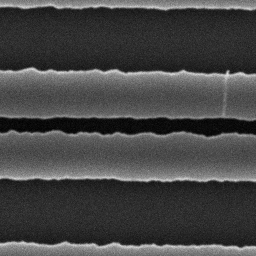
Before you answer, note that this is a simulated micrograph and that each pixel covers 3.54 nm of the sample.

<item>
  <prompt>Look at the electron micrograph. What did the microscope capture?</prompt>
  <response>lines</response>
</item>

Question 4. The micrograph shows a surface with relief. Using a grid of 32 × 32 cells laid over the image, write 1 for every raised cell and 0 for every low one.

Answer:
11111111111111111111111111111111
00000000000000000000000000000000
00000000000000000000000000000000
00000000000000000000000000000000
00000000000000000000000000000000
00000000000000000000000000000000
00000000000000000000000000000000
00000000000000000000000000000000
00000000000000000000000000000000
11111111111111111111111111111111
11111111111111111111111111111111
11111111111111111111111111111111
11111111111111111111111111111111
11111111111111111111111111111111
11111111111111111111111111111111
00000000000000000000000000000000
01000011000000000000001000000000
11111111111111111111111111111111
11111111111111111111111111111111
11111111111111111111111111111111
11111111111111111111111111111111
11111111111111111111111111111111
00000000000000011111111111111111
00000000000000000000000000000000
00000000000000000000000000000000
00000000000000000000000000000000
00000000000000000000000000000000
00000000000000000000000000000000
00000000000000000000000000000000
00000000000000000000000000000000
11111001100100100000000000000000
11111111111111111111111111111111